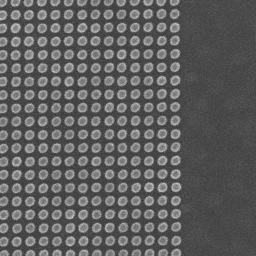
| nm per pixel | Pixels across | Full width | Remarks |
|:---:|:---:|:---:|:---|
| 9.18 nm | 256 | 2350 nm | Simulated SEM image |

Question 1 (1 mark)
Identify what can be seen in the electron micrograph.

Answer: a regular array of raised bodies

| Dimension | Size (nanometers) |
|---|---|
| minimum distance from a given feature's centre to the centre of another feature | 119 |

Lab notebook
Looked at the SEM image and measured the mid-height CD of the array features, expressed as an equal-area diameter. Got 82.9 nanometres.